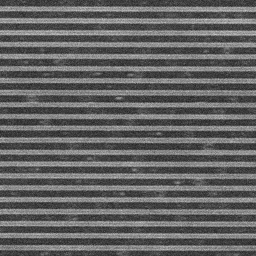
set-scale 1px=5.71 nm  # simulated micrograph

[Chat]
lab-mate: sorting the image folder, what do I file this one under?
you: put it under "parallel lines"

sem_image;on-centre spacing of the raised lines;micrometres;0.0682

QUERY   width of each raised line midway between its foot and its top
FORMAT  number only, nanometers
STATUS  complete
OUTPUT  24.3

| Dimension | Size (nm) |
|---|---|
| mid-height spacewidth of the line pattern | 43.5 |